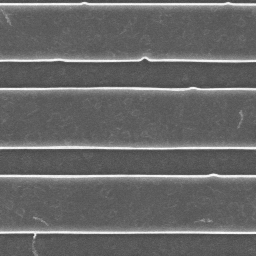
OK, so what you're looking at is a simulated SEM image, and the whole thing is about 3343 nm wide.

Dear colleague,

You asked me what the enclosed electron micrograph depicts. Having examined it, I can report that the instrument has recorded one or a few lines or trenches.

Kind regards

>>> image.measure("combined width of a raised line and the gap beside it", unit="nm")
1120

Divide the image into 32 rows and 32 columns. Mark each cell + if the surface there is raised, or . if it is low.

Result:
..........+.................+...
++++++++++++++++++++++++++++++++
++++++++++++++++++++++++++++++++
++++++++++++++++++++++++++++++++
++++++++++++++++++++++++++++++++
++++++++++++++++++++++++++++++++
++++++++++++++++++++++++++++++++
+++++...++++++++++.+++++++++++++
................................
................................
................................
++++++++++++++++++++++++++++++++
++++++++++++++++++++++++++++++++
++++++++++++++++++++++++++++++++
++++++++++++++++++++++++++++++++
++++++++++++++++++++++++++++++++
++++++++++++++++++++++++++++++++
++++++++++++++++++++++++++++++++
+++..........+++++++++++......++
................................
................................
................................
++++++++++++++++++++++++++++++++
++++++++++++++++++++++++++++++++
++++++++++++++++++++++++++++++++
++++++++++++++++++++++++++++++++
++++++++++++++++++++++++++++++++
++++++++++++++++++++++++++++++++
++++++++++++++++++++++++++++++++
................................
................................
................................